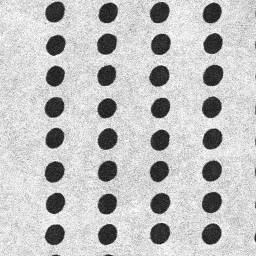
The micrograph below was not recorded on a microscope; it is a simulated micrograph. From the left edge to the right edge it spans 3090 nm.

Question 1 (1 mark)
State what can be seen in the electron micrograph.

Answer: a regular array of holes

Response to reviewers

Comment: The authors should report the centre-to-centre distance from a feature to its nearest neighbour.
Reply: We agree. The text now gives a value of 376 nm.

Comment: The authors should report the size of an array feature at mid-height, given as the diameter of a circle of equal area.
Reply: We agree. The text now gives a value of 248 nanometers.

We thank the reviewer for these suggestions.